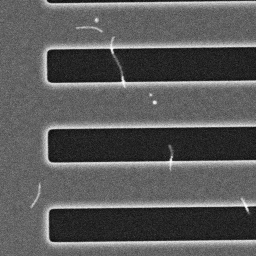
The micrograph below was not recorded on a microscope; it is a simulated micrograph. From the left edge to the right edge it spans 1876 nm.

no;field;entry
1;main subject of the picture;groups of lines, slits or small figures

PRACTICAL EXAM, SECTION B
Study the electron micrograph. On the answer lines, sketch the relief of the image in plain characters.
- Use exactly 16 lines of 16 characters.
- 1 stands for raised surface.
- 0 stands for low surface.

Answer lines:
1111111111111111
1111111111111111
1111111111111111
1110000000000000
1110000000000000
1111111111111111
1111111111111111
1111111111111111
1110000000000000
1110000000000000
1111111111111111
1111111111111111
1111111111111111
1110000000000000
1110000000000000
1111111111111111